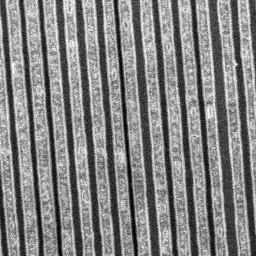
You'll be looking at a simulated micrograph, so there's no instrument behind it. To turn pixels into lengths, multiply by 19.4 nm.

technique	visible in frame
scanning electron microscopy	parallel lines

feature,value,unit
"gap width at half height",171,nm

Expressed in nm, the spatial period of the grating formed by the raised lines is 371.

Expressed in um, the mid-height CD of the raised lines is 0.207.